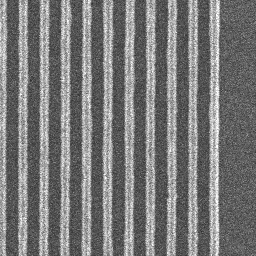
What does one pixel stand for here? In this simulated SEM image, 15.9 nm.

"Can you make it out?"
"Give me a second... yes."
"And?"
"parallel lines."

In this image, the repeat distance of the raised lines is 337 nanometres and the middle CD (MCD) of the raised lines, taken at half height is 6.75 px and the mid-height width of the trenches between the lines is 228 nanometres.